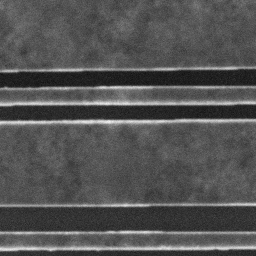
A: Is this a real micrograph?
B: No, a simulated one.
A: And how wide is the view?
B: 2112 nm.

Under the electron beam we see lines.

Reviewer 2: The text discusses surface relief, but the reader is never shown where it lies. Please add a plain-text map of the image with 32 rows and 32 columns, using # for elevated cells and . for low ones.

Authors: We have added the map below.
################################
################################
################################
################################
################################
################################
################################
################################
################################
................................
................................
################################
################################
................................
................................
################################
################################
################################
################################
################################
################################
################################
################################
################################
################################
################################
................................
................................
................................
################################
################################
................................